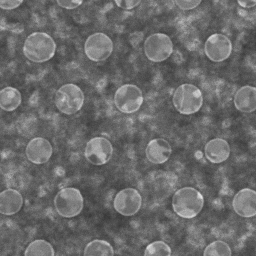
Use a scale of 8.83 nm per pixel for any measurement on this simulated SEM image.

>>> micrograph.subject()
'a regular array of raised bodies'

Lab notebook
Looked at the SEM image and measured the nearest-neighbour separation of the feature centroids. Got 521 nm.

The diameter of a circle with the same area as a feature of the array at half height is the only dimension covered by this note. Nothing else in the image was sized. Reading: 0.242 microns